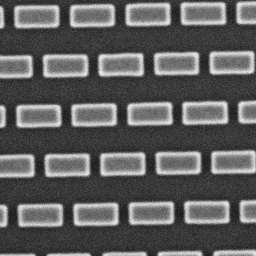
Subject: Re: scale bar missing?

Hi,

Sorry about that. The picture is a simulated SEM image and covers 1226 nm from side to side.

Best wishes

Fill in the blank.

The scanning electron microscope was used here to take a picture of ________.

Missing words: groups of lines, slits or small figures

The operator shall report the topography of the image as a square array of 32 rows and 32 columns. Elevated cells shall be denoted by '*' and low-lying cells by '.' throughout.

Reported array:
.......................*****..**
..*****..*****..*****..*****..**
..*****..*****..*****..*****..**
................................
................................
................................
................................
****..*****.******.******.******
****..*****.******.******.******
****............................
................................
................................
................................
..*****..*****..*****..*****..**
*.******.*****..*****..*****..**
..*****..*****..*****...........
................................
................................
................................
.***..*****..*****..*****..*****
****..*****..*****..*****..*****
****..*****..*****..*****..****.
................................
................................
................................
.................****..*****..**
*.******.******.******.******.**
*.******.******.******.*****..**
................................
................................
................................
...........................*****